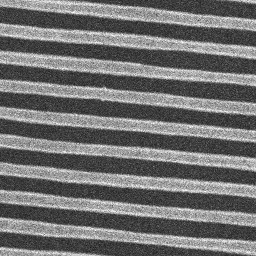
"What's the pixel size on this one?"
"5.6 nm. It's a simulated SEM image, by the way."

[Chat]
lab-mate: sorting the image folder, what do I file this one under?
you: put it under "parallel lines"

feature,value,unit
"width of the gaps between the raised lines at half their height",95.5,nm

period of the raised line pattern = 156 nm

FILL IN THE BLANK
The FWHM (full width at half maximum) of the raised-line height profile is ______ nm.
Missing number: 59.9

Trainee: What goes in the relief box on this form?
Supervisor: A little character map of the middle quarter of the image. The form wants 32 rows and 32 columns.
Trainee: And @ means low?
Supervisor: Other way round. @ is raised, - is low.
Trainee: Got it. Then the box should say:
@@@@@@@@@@@@@@@@@@@@@-----------
--@@@@@@@@@@@@@@@@@@@@@@@@@@@@@-
---------------@@@@@@@@@@@@@@@@@
-------------------------@@@@@@@
--------------------------------
--------------------------------
@@@@@@@@@@@@--------------------
@@@@@@@@@@@@@@@@@@@@@@@---------
----@@-@@@@@@@@@@@@@@@@@@@@@@@@-
---------------@@@@@@@@@@@@@@@@@
----------------------------@@@@
--------------------------------
--------------------------------
@@@@@@@@@@----------------------
@@@@@@@@@@@@@@@@@@@@@@----------
--@@@@@@@@@@@@@@@@@@@@@@@@@@@@@@
---------------@@@@@@@@@@@@@@@@@
--------------------------@@@@@@
--------------------------------
--------------------------------
@@@@@@@@@@@---------------------
@@@@@@@@@@@@@@@@@@@@@@@@--------
---@-@@@@@@@@@@@@@@@@@@@@@@@@@@@
----------------@-@@@@@@@@@@@@@@
-----------------------------@@@
--------------------------------
--------------------------------
@@@@@@@@@-----------------------
@@@@@@@@@@@@@@@@@@@@@@----------
---@@@@@@@@@@@@@@@@@@@@@@@@@@@@@
--------------@@@@@@@@@@@@@@@@@@
---------------------------@@@@@